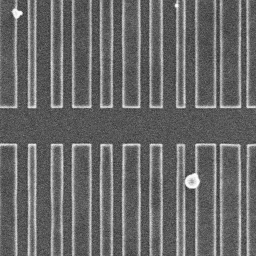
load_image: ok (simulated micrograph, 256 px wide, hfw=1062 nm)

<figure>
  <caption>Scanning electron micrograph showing groups of lines, slits or small figures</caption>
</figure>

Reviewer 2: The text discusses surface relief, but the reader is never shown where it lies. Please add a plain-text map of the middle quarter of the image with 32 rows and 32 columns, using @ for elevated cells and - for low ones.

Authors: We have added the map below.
--@@@@@--@@@---@@@@--@@@@---@@--
--@@@@@--@@@---@@@@--@@@@---@@--
--@@@@@--@@@---@@@@---@@@---@@--
--@@@@@--@@@---@@@@---@@@---@@--
--@@@@@--@@@---@@@@---@@@---@@--
--@@@@@--@@@---@@@@---@@@---@@--
--@@@@@--@@@---@@@@---@@@---@@--
--@@@@@--@@@---@@@@---@@@---@@--
--@@@@@--@@@---@@@@---@@@---@@--
--@@@@@--@@@---@@@@---@@@---@@--
--@@@@@--@@@---@@@@---@@@---@@--
--------------------------------
--------------------------------
--------------------------------
--------------------------------
--------------------------------
--------------------------------
--------------------------------
--------------------------------
--------------------------------
--@@@@@--@@@---@@@@---@@----@@--
--@@@@@--@@@---@@@@---@@----@@--
--@@@@@--@@@---@@@@---@@----@@--
--@@@@@--@@@---@@@@---@@----@@--
--@@@@@--@@@---@@@@---@@----@@--
--@@@@@--@@@---@@@@---@@----@@--
--@@@@@--@@@---@@@@---@@----@@--
--@@@@@--@@@---@@@@---@@----@@--
--@@@@@--@@@---@@@@---@@----@@-@
--@@@@@--@@@---@@@@---@@----@@@@
--@@@@@--@@@---@@@@---@@----@@-@
--@@@@@--@@@---@@@@--@@@----@@--